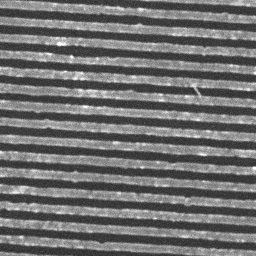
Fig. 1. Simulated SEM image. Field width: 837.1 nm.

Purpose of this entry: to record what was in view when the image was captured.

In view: parallel lines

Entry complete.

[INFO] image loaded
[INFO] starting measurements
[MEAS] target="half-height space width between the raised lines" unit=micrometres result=0.031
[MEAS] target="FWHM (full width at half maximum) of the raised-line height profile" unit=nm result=24.9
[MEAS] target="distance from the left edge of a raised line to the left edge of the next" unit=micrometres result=0.055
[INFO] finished